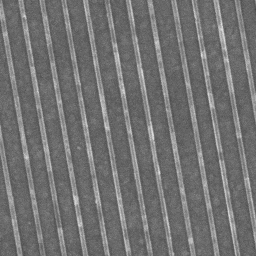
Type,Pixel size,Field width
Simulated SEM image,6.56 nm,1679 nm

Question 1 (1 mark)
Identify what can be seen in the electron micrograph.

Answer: parallel lines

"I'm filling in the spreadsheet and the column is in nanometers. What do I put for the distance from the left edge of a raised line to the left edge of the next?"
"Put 140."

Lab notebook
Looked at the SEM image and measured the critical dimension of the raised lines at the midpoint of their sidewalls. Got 28.3 nanometers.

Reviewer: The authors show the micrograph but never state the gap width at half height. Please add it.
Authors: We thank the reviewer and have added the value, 114 nm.